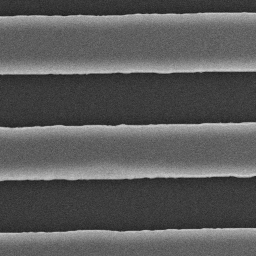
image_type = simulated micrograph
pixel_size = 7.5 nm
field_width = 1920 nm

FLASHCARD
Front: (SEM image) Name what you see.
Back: lines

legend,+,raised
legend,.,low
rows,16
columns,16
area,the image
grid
................
++++++++++++++++
++++++++++++++++
++++++++++++++++
+++++++++++++...
................
................
................
++++++++++++++++
++++++++++++++++
++++++++++++++++
................
................
................
....++++++++++++
++++++++++++++++